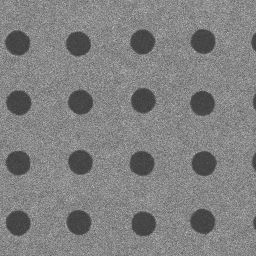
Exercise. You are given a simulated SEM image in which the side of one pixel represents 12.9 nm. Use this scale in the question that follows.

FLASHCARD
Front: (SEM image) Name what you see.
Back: a regular array of holes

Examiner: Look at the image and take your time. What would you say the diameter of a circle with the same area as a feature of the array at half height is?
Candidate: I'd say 0.323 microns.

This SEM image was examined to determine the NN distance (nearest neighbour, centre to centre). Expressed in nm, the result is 768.